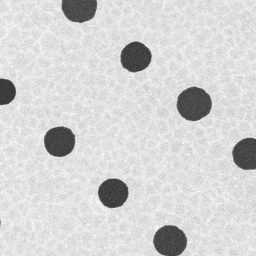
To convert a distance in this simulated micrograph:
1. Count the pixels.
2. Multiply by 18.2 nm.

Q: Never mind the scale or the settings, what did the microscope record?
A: holes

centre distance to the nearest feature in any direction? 1.36 µm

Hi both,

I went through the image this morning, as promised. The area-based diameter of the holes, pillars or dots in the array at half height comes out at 571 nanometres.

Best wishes